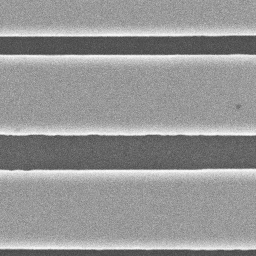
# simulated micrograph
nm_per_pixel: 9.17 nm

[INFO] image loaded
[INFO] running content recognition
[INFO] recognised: lines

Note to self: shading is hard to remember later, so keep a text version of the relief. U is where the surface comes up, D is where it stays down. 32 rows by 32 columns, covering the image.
UUUUUUUUUUUUUUUUUUUUUUUUUUUUUUUU
UUUUUUUUUUUUUUUUUUUUUUUUUUUUUUUU
UUUUUUUUUUUUUUUUUUUUUUUUUUUUUUUU
UUUUUUUUUUUUUUUUUUUUUUUUUUUUUUUU
DDDDDDDDDDDDDDDDDDDDDDDDDDDDDDDD
DDDDDDDDDDDDDDDDDDDDDDDDDDDDDDDD
DDDDDDDDDDDDDDDDDDDDDDDDDDDDDDDD
UUUUUUUUUUUUUUUUUUUUUUUUUUUUUUUU
UUUUUUUUUUUUUUUUUUUUUUUUUUUUUUUU
UUUUUUUUUUUUUUUUUUUUUUUUUUUUUUUU
UUUUUUUUUUUUUUUUUUUUUUUUUUUUUUUU
UUUUUUUUUUUUUUUUUUUUUUUUUUUUUUUU
UUUUUUUUUUUUUUUUUUUUUUUUUUUUUUUU
UUUUUUUUUUUUUUUUUUUUUUUUUUUUUUUU
UUUUUUUUUUUUUUUUUUUUUUUUUUUUUUUU
UUUUUUUUUUUUUUUUUUUUUUUUUUUUUUUU
UUUUUUUUUUUUUUUUUUUUUUUUUUUUUUUU
DDDDDDDDDDDDDDDDDDDDDDDDDDDDDDDD
DDDDDDDDDDDDDDDDDDDDDDDDDDDDDDDD
DDDDDDDDDDDDDDDDDDDDDDDDDDDDDDDD
DDDDDDDDDDDDDDDDDDDDDDDDDDDDDDDD
UUUUUUUUUUUUUUUUUUUUUUUUUUUUUUUU
UUUUUUUUUUUUUUUUUUUUUUUUUUUUUUUU
UUUUUUUUUUUUUUUUUUUUUUUUUUUUUUUU
UUUUUUUUUUUUUUUUUUUUUUUUUUUUUUUU
UUUUUUUUUUUUUUUUUUUUUUUUUUUUUUUU
UUUUUUUUUUUUUUUUUUUUUUUUUUUUUUUU
UUUUUUUUUUUUUUUUUUUUUUUUUUUUUUUU
UUUUUUUUUUUUUUUUUUUUUUUUUUUUUUUU
UUUUUUUUUUUUUUUUUUUUUUUUUUUUUUUU
UUUUUUUUUUUUUUUUUUUUUUUUUUUUUUUU
DDDDDDDDDDDDDDDDDDDDDDDDDDDDDDDD